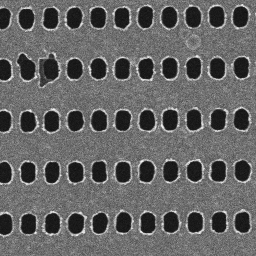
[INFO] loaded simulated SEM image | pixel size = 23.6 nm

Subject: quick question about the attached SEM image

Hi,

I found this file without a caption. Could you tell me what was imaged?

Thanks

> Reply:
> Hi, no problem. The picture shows a regular array of holes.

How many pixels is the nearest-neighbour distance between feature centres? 23.6